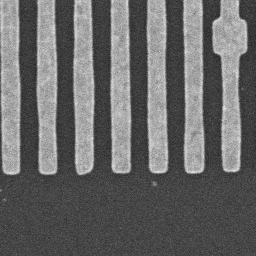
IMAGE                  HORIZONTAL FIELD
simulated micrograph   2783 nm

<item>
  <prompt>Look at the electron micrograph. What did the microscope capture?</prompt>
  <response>wiring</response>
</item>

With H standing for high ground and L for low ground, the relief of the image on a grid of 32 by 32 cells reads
HHLLLHHLLHHLLLHHLLHHHLLHHLLLHHLL
HHLLLHHLLHHLLLHHLLHHHLLHHLLLHHLL
HHLLLHHLLHHLLLHHLLHHHLLHHLLHHHLL
HHLLLHHLLHHLLLHHLLHHHLLHHLLHHHHL
HHLLLHHLLHHLLLHHLLHHHLLHHLLHHHHL
HHLLLHHLLHHLLLHHLLHHHLLHHLLHHHHL
HHLLLHHLLHHLLLHHLLHHHLLHHLLHHHHL
HHLLLHHLLHHHLLHHLLLHHLLHHLLLHHLL
HHLLLHHLLHHHLLHHLLLHHLLHHLLLHHLL
HHLLLHHLLHHHLLHHLLLHHLLHHLLLHHLL
HHLLLHHLLHHHLLHHLLLHHLLHHLLLHHLL
HHLLLHHLLHHHLLHHLLLHHLLHHLLLHHLL
HHLLLHHLLHHHLLHHLLLHHLLHHLLLHHLL
HHLLLHHLLHHHLLHHLLLHHLLHHLLLHHLL
HHLLLHHLLHHHLLHHLLLHHLLHHLLLHHLL
HHLLLHHLLLHHLLHHLLLHHLLHHLLLHHLL
HHLLLHHLLLHHLLHHLLLHHLLHHLLLHHLL
HHLLLHHLLLHHLLHHLLLHHLLHHLLLHHLL
HHLLLHHLLLHHLLHHLLLHHLLHHLLLHHLL
HHLLLHHLLLHHLLHHLLLHHLLHHLLLHHLL
HHLLLHHLLLHHLLHHLLLHHLLHHLLLHHLL
LHLLLHHLLLHLLLHHLLLHLLLLHLLLLLLL
LLLLLLLLLLLLLLLLLLLLLLLLLLLLLLLL
LLLLLLLLLLLLLLLLLLLLLLLLLLLLLLLL
LLLLLLLLLLLLLLLLLLLLLLLLLLLLLLLL
LLLLLLLLLLLLLLLLLLLLLLLLLLLLLLLL
LLLLLLLLLLLLLLLLLLLLLLLLLLLLLLLL
LLLLLLLLLLLLLLLLLLLLLLLLLLLLLLLL
LLLLLLLLLLLLLLLLLLLLLLLLLLLLLLLL
LLLLLLLLLLLLLLLLLLLLLLLLLLLLLLLL
LLLLLLLLLLLLLLLLLLLLLLLLLLLLLLLL
LLLLLLLLLLLLLLLLLLLLLLLLLLLLLLLL